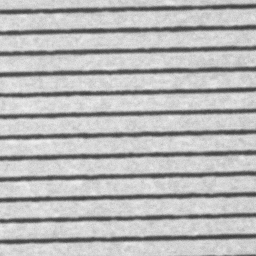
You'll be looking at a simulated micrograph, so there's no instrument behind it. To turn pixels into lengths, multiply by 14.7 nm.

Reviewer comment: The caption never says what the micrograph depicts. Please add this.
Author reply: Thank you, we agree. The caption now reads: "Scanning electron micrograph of parallel lines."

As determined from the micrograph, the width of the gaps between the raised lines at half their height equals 91.6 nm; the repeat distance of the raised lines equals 306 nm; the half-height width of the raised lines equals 0.212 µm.